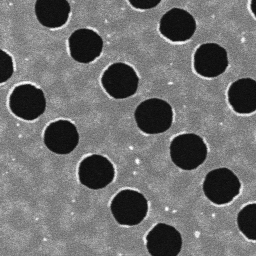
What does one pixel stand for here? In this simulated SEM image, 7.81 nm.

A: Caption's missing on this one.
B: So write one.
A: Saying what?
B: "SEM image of a regular array of holes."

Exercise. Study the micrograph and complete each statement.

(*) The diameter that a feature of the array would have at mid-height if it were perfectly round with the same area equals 285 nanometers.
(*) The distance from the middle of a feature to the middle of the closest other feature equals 380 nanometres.